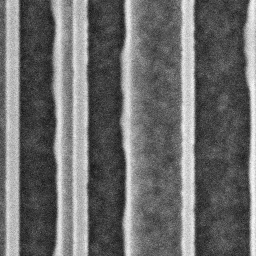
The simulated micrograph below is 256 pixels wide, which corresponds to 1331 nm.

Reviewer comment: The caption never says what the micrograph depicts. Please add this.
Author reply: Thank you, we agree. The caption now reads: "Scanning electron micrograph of lines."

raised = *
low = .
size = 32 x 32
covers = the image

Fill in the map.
**.....****.....********........
**.....****.....********........
**.....****.....********.......*
**.....****.....********.......*
**.....****.....********.......*
**.....****.....********.......*
**.....****.....********.......*
**.....****.....********.......*
**.....****.....********.......*
**.....****.....********.......*
**.....****.....********........
**.....****.....********........
**.....****.....********........
**.....****.....********........
**.....****.....********........
**......***.....********........
**.....****.....********........
**.....****.....********........
**.....****.....********........
**.....****.....********........
**......***.....********........
**......***.....********........
**......***.....********........
**......***.....********........
**......***.....********........
**......***.....********........
**......***.....********........
**......***.....********........
**......***.....********........
**.....****.....********........
**.....****.....********........
**.....****.....********........